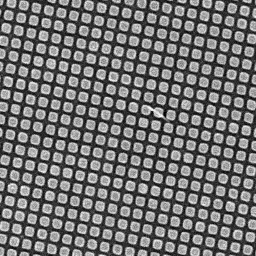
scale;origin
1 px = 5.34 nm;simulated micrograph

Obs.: a regular array of raised bodies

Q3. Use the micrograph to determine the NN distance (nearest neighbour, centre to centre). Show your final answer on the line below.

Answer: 67.4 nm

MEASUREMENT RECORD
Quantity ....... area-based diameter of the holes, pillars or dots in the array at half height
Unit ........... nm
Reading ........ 52.8